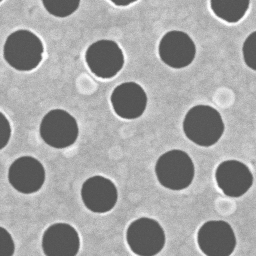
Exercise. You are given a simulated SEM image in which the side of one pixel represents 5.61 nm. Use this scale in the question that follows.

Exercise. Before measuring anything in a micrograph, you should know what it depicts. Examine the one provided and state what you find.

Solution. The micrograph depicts a regular array of holes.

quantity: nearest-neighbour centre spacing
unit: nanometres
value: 315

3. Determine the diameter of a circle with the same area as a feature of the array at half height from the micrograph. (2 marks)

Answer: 215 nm